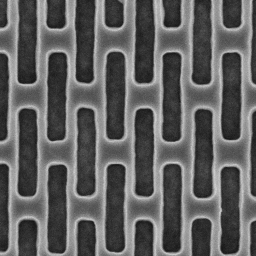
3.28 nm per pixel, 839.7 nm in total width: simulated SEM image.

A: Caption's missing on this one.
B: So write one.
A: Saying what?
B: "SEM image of a regular array of holes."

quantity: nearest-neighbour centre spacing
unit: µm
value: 0.189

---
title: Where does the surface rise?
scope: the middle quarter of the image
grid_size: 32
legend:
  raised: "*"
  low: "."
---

.**.....**......*......**....***
.**.....**......*......**....***
.**.....**......*......*.....***
.**.....**.....**......*.....***
.***...***.....***....**.....***
.*********.....**********....***
.*********......*********....***
.*********.....**********....***
.*********.....**********....***
.*********.....**********....***
.*********.....**********....***
.**....***.....***....***.....**
.**.....**.....***....**......**
.**.....***....**......**.....**
.**.....***....**.....***.....**
***.....**.....**.....**.....***
.**.....**.....**.....**.....***
***.....**.....**.....**.....***
***.....***....**......**....***
***.....*********......***.*****
***.....*********......*********
***.....*********......*********
***.....*********......*********
***.....*********......*********
***.....*********......*********
***.....***....**......**....***
.**.....***.....*.....***.....**
.**.....***....**......**.....**
.**.....***....***.....**.....**
.**.....***....**.....***.....**
.**.....**.....**.....**......**
.**.....**.....**.....**......**